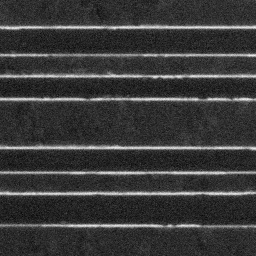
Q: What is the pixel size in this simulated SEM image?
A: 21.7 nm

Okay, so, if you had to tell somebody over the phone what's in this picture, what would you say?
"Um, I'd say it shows lines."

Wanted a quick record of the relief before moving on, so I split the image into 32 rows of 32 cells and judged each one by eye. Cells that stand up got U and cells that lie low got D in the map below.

UUUUUUUUUUUUUUUUUUUUUUUUUUUUUUUU
UUUUUUUUUUUUUUUUUUUUUUUUUUUUUUUU
UUUUUUUUUUUUUUUUUUUUUUUUUUUUUUUU
DDDDDDDDDDDDDDDDDDDDDDDDDDDDDDDD
DDDDDDDDDDDDDDDDDDDDDDDDDDDDDDDD
DDDDDDDDDDDDDDDDDDDDDDDDDDDDDDDD
DDDDDDDDDDDDDDDDDDDDDDDDDDDDDDDD
UUUUUUUUUUUUUUUUUUUUUUUUUUUUUUUU
UUUUUUUUUUUUUUUUUUUUUUUUUUUUUUUU
UUUUUUUUUUUUUUUUUUUUUUUUUUUUUUUU
DDDDDDDDDDDDDDDDDDDDDDDDDDDDDDDD
DDDDDDDDDDDDDDDDDDDDDDDDDDDDDDDD
UUUUUUUUUUUUUUUUUUUUUUUDDDUUUUUU
UUUUUUUUUUUUUUUUUUUUUUUUUUUUUUUU
UUUUUUUUUUUUUUUUUUUUUUUUUUUUUUUU
UUUUUUUUUUUUUUUUUUUUUUUUUUUUUUUU
UUUUUUUUUUUUUUUUUUUUUUUUUUUUUUUU
UUUUUUUUUUUUUUUUUUUUUUUUUUUUUUUU
DDDDDDDDDDDDDDDDDDDDDDDDDDDDDDDD
DDDDDDDDDDDDDDDDDDDDDDDDDDDDDDDD
DDDDDDDDDDDDDDDDDDDDDDDDDDDDDDDD
DDDDDDDDDDDDDDDDDDDDDDDDDDDDDDDD
UUUUUUUUUUUUUUUUUUUUUUUUUUUUUUUU
UUUUUUUUUUUUUUUUUUUUUUUUUUUUUUUU
DDDDDDDDDDDDDDDDDDDDDDDDDDDDDDDD
DDDDDDDDDDDDDDDDDDDDDDDDDDDDDDDD
DDDDDDDDDDDDDDDDDDDDDDDDDDDDDDDD
DDDDDDDDDDDDDDDDDDDDDDDDDDDDDDDD
UUUUUUUUUUUUUUUUUUUUUUUUUUUUUUUU
UUUUUUUUUUUUUUUUUUUUUUUUUUUUUUUU
UUUUUUUUUUUUUUUUUUUUUUUUUUUUUUUU
UUUUUUUUUUUUUUUUUUUUUUUUUUUUUUUU